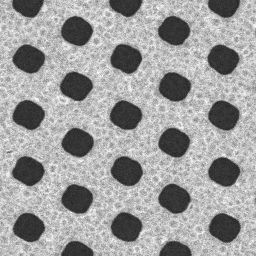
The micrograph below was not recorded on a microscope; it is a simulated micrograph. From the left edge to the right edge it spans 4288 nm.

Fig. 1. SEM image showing a regular array of holes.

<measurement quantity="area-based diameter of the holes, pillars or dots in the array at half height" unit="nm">502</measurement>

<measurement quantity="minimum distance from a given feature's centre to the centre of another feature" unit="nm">929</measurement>